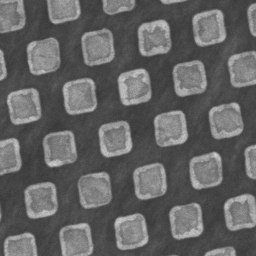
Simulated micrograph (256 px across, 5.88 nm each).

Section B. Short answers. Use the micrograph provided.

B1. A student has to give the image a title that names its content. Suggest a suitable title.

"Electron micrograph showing a regular array of raised bodies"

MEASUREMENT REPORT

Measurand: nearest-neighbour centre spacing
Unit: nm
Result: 316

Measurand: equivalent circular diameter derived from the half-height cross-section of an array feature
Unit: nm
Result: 208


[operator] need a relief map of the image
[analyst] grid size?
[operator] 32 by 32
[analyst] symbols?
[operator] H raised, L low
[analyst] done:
HHHLLLHHHHLLLHHHHLLLLLLLLLLLLLLL
HHHLLLHHHHLLLHHLLLLLLLLLLLHHLLLH
HHHLLLHHHLLLLLLLLLLLLLLLHHHHLLLH
HHHLLLLLLLLLLLLLLHHHHLLLHHHHLLLH
LLLLLLLLLLHHHHLLLHHHHLLLHHHHLLLL
LLLLHHHLLLHHHHLLLHHHHLLLLHLLLLLL
LLLHHHHLLLHHHHLLLLHHHLLLLLLLLLLH
LLLLHHHLLLLHHHLLLLLLLLLLLLLLLHHH
HLLLHHHLLLLLLLLLLLLLLLHHHHLLLHHH
HLLLLLLLLLLLLLLHHHHLLLHHHHLLLHHH
LLLLLLLLHHHHLLLHHHHLLLHHHHLLLHHH
LLHHHLLLHHHHLLLHHHHLLLHHHLLLLLLL
LHHHHLLLHHHHLLLHHHLLLLLLLLLLLLLL
LHHHHLLLHHHHLLLLLLLLLLLLLLLHHHLL
LHHHHLLLLLLLLLLLLLLLHHHLLLHHHHLL
LLLLLLLLLLLLLHHHLLLHHHHLLLHHHHLL
LLLLLLLLHLLLHHHHLLLHHHHLLLHHHHLL
LHLLLHHHHLLLHHHHLLLLHHHLLLLLLLLL
HHLLLHHHHLLLLHHHLLLLLLLLLLLLLLLH
HHHLLLHHHHLLLHLLLLLLLLLLLHHLLLLH
HHHLLLHHLLLLLLLLLLLHLLLLHHHHLLLH
HHLLLLLLLLLLLLLLLHHHHLLLHHHHLLLH
LLLLLLLLLLHHHHLLLHHHHLLLHHHHLLLL
LLLLHHHLLLHHHHLLLHHHHLLLHLLLLLLL
LLLHHHHLLLHHHHLLLHHHLLLLLLLLLLHL
LLLHHHHLLLHHHLLLLLLLLLLLHLLLHHHH
LLLHHHHLLLLLLLLLLLLLLHHHHLLLHHHH
LLLLLLLLLLLLLLLHHHLLLHHHHLLLHHHH
LLLLLLLLHHHLLLHHHHLLLHHHHLLLLHLL
LLHHLLLHHHHLLLHHHHLLLLHHLLLLLLLL
LHHHLLLLHHHLLLLHHHLLLLLLLLLLLLLL
LHHHHLLLHHHLLLLLLLLLLLLLLLHHHLLL